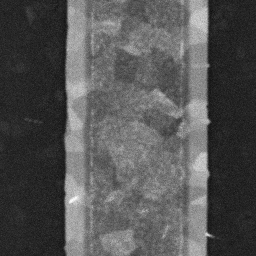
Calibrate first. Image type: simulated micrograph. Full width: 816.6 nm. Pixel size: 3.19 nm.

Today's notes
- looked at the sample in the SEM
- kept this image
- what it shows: one or a few lines or trenches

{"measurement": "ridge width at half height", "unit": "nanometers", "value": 391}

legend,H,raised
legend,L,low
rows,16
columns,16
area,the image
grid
LLLLLHHHHHHHLLLL
LLLLLHHHHHHHLLLL
LLLLLHHHHHHHLLLL
LLLLLHHHHHHHLLLL
LLLLLHHHHHHHLLLL
LLLLLHHHHHHHLLLL
LLLLLHHHHHHHLLLL
LLLLLHHHHHHHLLLL
LLLLLHHHHHHHLLLL
LLLLLHHHHHHHLLLL
LLLLLHHHHHHHLLLL
LLLLLHHHHHHHLLLL
LLLLLHHHHHHHLLLL
LLLLLHHHHHHHLLLL
LLLLLHHHHHHHLLLL
LLLLLHHHHHHHLLLL